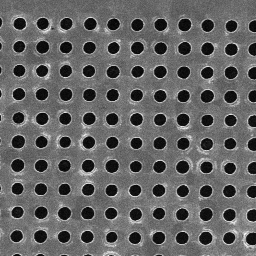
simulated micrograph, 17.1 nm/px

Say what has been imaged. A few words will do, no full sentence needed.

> a regular array of holes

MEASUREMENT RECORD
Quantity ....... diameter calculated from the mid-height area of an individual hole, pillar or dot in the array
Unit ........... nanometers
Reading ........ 216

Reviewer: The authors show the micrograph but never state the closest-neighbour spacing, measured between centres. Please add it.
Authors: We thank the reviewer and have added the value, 398 nm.